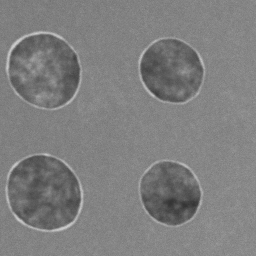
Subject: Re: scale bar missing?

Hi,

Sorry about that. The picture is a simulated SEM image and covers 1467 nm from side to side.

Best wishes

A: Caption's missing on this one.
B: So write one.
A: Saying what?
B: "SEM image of holes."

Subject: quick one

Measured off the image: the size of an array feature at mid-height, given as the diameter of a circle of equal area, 69.5 pixels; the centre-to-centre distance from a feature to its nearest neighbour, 702 nanometres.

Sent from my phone